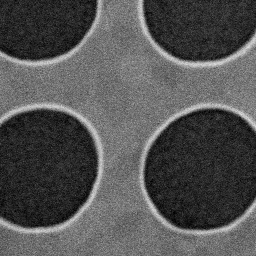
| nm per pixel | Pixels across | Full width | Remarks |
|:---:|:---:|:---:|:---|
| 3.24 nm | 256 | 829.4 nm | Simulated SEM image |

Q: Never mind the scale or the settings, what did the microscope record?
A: holes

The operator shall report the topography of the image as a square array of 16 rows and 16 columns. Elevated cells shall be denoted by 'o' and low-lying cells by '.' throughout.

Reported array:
......ooo.......
......ooo.......
.....ooooo......
....ooooooo...oo
oooooooooooooooo
oooooooooooooooo
oooooooooooooooo
.....oooooo....o
......oooo......
......ooo.......
......ooo.......
......ooo.......
......ooo.......
.....ooooo.....o
oooooooooooooooo
oooooooooooooooo